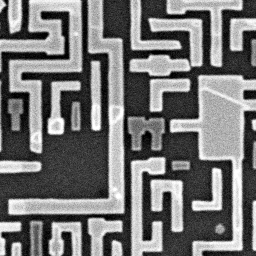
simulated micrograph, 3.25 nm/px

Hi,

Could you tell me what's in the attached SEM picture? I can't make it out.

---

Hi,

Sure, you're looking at wiring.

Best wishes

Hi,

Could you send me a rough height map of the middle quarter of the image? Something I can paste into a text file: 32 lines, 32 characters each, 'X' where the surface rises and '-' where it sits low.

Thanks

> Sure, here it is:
XXXX---XX--XXXX--XXXXXXXXXXXXXX-
XXXX---XX--XXXX--XXXXXXXXXXXXXX-
-------XX--XXXX-------XXXX------
-------XX--XXXX-----------------
-------XX--XXXX-------XXXXXXXXX-
XXXX---XX--XXXX-------XXXXXXXXX-
-------XX--XXXX-------XXXXXXXXX-
-------XX--XXXX-------XX--------
-------XX--XXXX-------XX--------
-------XX--XXXX-------XX--------
--XX---XX--XXXX-------XX--------
--XX---XX--XXXX-------XX--------
--XX---XX--XXXX-----------------
--XX---XX--XXXX-XXXX------------
--XX---XX--XXXX-XXXXXXXXX--XXXXX
--XX---XX---XXX-XXXXXXXXX--XXXXX
------------XXX-XXXXXXXXX--XXXXX
-----------XXXX--XXX--XX--------
-----------XXXX--XX---XX--------
-----------XXXX--XX---XX--------
-----------XXXX--XX---XX--------
-----------XXXX-----------------
-----------XXXX-----------------
-----------XXXX-----------------
-----------XXXX---XXXXXXX-------
-----------XXXX--XXXXXXXX--XXXX-
-----------XXXX--XXXXXXXX-------
-----------XXXX--XX-------------
-----------XXXX--XX-------------
-----------XXXX--XX---XXXXXXX---
-----------XXXX--XX---XXXXXXX---
-----------XXXX--XX---XXXXXXX---